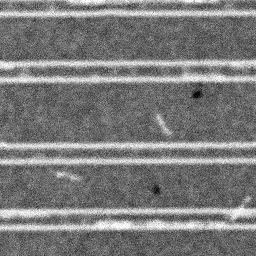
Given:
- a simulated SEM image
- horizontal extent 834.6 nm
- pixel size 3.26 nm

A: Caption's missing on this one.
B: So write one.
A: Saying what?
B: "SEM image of one or a few lines or trenches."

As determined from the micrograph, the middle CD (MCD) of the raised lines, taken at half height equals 55.4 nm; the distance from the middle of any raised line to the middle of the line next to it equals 241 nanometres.